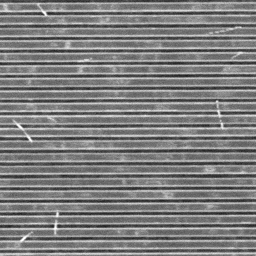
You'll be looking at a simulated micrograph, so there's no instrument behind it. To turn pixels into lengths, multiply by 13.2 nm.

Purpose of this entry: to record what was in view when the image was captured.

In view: parallel lines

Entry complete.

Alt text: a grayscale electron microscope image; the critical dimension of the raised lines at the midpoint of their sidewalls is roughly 0.116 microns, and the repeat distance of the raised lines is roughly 0.165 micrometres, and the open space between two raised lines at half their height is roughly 0.0512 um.